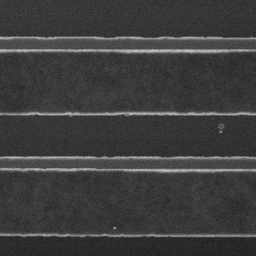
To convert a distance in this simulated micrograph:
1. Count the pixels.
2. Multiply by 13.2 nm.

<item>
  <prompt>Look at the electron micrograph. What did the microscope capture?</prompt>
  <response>lines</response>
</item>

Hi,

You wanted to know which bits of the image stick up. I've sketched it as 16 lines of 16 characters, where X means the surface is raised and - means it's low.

----------------
----------------
----------------
XXXXXXXXXXXXXXXX
XXXXXXXXXXXXXXXX
XXXXXXXXXXXXXXXX
XXXXXXXXXXXXXXXX
----------------
----------------
----------------
----------------
XXXXXXXXXXXXXXXX
XXXXXXXXXXXXXXXX
XXXXXXXXXXXXXXXX
XXXXXXXXXXXXXXXX
----------------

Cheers